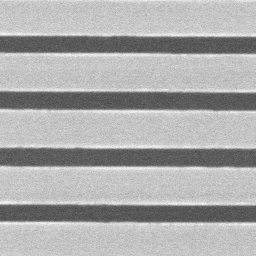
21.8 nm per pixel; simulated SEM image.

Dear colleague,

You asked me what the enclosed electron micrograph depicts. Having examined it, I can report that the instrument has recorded lines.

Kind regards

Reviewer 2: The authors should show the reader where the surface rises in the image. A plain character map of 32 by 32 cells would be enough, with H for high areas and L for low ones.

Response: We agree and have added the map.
HHHHHHHHHHHHHHHHHHHHHHHHHHHHHHHH
HHHHHHHHHHHHHHHHHHHHHHHHHHHHHHHH
HHHHHHHHHHHHHHHHHHHHHHHHHHHHHHHH
HHHHHHHHHHHHHHHHHHHHHHHHHHHHHHHH
LLLLLLLLLLLLLLLLLLLLLLLLLLLLLLLL
LLLLLLLLLLLLLLLLLLLLLLLLLLLLLLLL
LLLLLLLLLLLLLLLLLLLLLLLLLLLLLLLL
HHHHHHHHHHHHHHHHHHHHHHHHHHHHHHHH
HHHHHHHHHHHHHHHHHHHHHHHHHHHHHHHH
HHHHHHHHHHHHHHHHHHHHHHHHHHHHHHHH
HHHHHHHHHHHHHHHHHHHHHHHHHHHHHHHH
LLLLLLLLLLLLLLLLLLLLLLLLLLLLLLLL
LLLLLLLLLLLLLLLLLLLLLLLLLLLLLLLL
LLLLLLLLLLLLLLLLLLLLLLLLLLLLLLLL
HHHHHHHHHHHHHHHHHHHHHHHHHHHHHHHH
HHHHHHHHHHHHHHHHHHHHHHHHHHHHHHHH
HHHHHHHHHHHHHHHHHHHHHHHHHHHHHHHH
HHHHHHHHHHHHHHHHHHHHHHHHHHHHHHHH
LLLLLLLLLLLLLLLLLLLLLLLLLLLLLLHH
LLLLLLLLLLLLLLLLLLLLLLLLLLLLLLLL
LLLLLLLLLLLLLLLLLLLLLLLLLLLLLLLL
HHHHHHHHHHHHHHHHHHHHHHHHHHHHHHHH
HHHHHHHHHHHHHHHHHHHHHHHHHHHHHHHH
HHHHHHHHHHHHHHHHHHHHHHHHHHHHHHHH
HHHHHHHHHHHHHHHHHHHHHHHHHHHHHHHH
LLLLLLLLLHHHHHHHHHHHHHHHHHHHHHHH
LLLLLLLLLLLLLLLLLLLLLLLLLLLLLLLL
LLLLLLLLLLLLLLLLLLLLLLLLLLLLLLLL
HHHHHHHHHHHHHHHHHHHHHHHHHHHHHHHH
HHHHHHHHHHHHHHHHHHHHHHHHHHHHHHHH
HHHHHHHHHHHHHHHHHHHHHHHHHHHHHHHH
HHHHHHHHHHHHHHHHHHHHHHHHHHHHHHHH